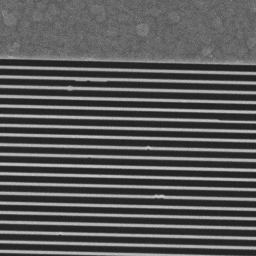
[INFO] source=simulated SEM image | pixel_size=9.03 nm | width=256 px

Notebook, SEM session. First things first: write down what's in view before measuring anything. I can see parallel lines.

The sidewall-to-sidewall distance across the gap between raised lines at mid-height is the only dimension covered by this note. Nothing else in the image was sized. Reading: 0.062 µm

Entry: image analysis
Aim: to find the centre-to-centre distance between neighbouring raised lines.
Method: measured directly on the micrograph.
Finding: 87.5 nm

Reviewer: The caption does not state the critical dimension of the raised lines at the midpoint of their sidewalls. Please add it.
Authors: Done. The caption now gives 30.5 nm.